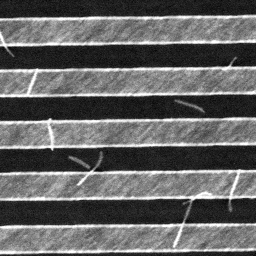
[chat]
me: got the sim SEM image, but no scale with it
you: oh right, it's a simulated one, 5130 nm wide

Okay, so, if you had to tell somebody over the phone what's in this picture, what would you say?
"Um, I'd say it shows lines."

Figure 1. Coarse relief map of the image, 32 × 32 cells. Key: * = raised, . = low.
................................
................................
********************************
********************************
********************************
*************...................
................................
................................
...........................*****
********************************
********************************
********************************
................................
................................
................................
********************************
********************************
********************************
*****.*.........................
................................
................................
...........*..******************
********************************
********************************
********************************
................................
................................
................................
********************************
********************************
********************************
*************...................